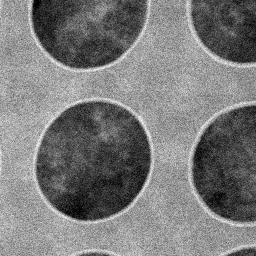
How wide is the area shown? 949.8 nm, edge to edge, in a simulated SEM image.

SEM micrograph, holes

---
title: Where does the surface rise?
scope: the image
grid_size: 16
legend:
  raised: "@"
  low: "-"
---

@@-------@@@----
@@-------@@@----
@@-------@@@----
@@@-----@@@@@---
@@@@@@@@@@@@@@@@
@@@@@@@@@@@@@@@@
@@@@@--@@@@@@@@@
@@@------@@@@---
@@@------@@@@---
@@-------@@@----
@@-------@@@----
@@-------@@@----
@@@-----@@@@@---
@@@@---@@@@@@@--
@@@@@@@@@@@@@@@@
@@@@@@@@@@@@@@@-